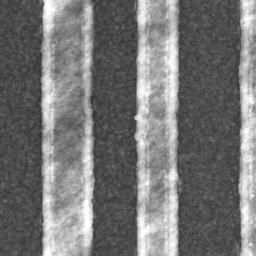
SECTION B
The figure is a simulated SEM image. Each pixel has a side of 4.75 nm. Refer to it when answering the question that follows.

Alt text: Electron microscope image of one or a few lines or trenches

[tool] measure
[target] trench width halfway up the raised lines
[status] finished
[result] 306 nanometers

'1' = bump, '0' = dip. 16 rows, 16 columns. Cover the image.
0001100001100001
0001100001100001
0001100001100001
0001100001100001
0001100001100001
0001100001100001
0001100001100001
0001110001100001
0001110001100001
0001100001100001
0001100001100001
0001100001100001
0001100001100001
0001100001100001
0001100001100001
0001100001100001